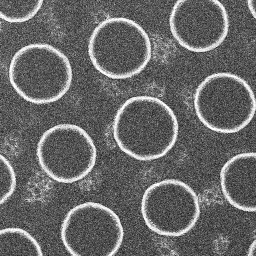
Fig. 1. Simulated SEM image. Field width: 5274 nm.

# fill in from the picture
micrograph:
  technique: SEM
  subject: raised bodies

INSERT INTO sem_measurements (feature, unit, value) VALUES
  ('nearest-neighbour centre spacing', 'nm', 1710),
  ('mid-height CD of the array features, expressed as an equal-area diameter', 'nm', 1190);